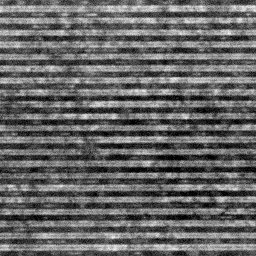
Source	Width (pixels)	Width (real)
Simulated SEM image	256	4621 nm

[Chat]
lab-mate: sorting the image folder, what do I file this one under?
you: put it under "parallel lines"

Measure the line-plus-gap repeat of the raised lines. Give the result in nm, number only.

216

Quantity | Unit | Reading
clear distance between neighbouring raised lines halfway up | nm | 138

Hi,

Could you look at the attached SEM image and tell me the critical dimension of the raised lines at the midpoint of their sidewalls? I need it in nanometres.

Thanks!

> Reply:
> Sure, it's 85.7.